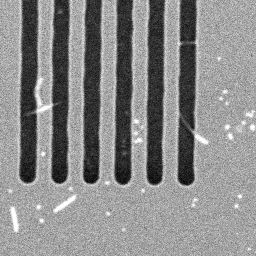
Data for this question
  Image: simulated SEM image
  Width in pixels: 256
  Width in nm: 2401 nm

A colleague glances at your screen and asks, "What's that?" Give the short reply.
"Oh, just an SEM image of groups of lines, slits or small figures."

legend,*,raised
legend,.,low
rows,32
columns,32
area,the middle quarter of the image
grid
.****....****....****....****...
.****....****....****....****...
.****....****....****....****...
.****....****....****....****...
.****....****....****....***....
.****....****....****....***....
.****....****....****....***....
.****....****....****....****...
.****....****....****....****...
.****....****....****....***....
.****....****....****....***....
.****....****....****....***....
.****....****....****....****...
.****....****....****....***....
.****....****....****....***....
.****....****....****....***....
.****....****....****....***....
.****....****....****....***....
.****....****....****....***....
.****....****....****....***....
.****....***.....****....***....
.****....***.....****....***....
.****....***.....****....***....
.****....***.....****....***....
.****....***.....****....***....
.****....***.....***.....***....
.****....***.....****....***....
.****....***.....****....***....
.****....****....****....***....
*****...*****...*****...*****...
******************************.*
********************************